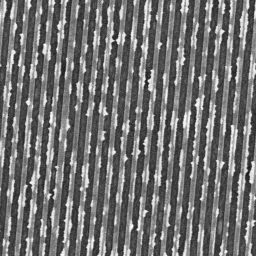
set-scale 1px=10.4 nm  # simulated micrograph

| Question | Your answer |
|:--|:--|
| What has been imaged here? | parallel lines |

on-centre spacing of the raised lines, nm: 126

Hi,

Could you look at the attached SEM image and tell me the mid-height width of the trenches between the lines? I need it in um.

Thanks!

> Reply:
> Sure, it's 0.0738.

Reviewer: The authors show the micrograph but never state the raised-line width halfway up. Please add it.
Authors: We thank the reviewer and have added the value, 0.053 um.